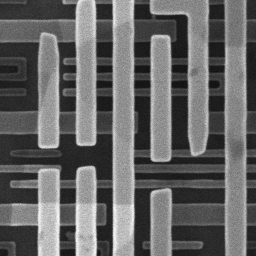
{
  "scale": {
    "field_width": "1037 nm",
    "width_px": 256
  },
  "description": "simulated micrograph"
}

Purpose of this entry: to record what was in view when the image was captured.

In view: wiring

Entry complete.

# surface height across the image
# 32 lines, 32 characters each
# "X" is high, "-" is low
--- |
----------XX--XXX--XXXXXXX--XXX-
---------XXX--XXX--XXXXXXX--XXX-
---------XXX--XXX-------XX--XXX-
---------XXX--XXX-------XX--XXX-
-----XX--XXX--XXX--XX---XX--XXX-
-----XX--XXX--XXX--XX---XX--XXX-
-----XX---XX--XXX--XX---XX--XXX-
-----XX---XX--XXX--XX---XX--XXX-
-----XX---XX--XXX--XX---XX--XXX-
-----XX---XX--XXX--XX---XX--XXX-
-----XX---XX--XXX--XX---XX--XXX-
-----XX---XX--XXX--XX---XX--XXX-
-----XX---XX--XXX--XX---XX--XXX-
-----XX---XX--XXX--XX---XX--XXX-
-----XX---XX--XXX--XX---XX--XXX-
-----XX--XXX--XXX--XX---XX--XXX-
-----XX--XXX--XXX--XX---XX--XXX-
-----XX---XX--XXX--XX---XX--XXX-
--------------XXX--XX---XX--XXX-
--------------XXX--XX-------XXX-
--------------XXX-----------XXX-
-----XX---XX--XXX-----------XXX-
-----XX---XX--XXX-----------XXX-
-----XX---XX--XXX-----------XXX-
-----XX---XX--XXX--XX-------XXX-
-----XX---XX--XXX--XX-------XXX-
-----XX--XXX--XXX--XX-------XXX-
-----XX--XXX--XXX--XX-------XXX-
-----XX--XXX--XXX--XX-------XXX-
-----XX--XXX--XXX--XX-------XXX-
-----XX--XXX--XXX--XX-------XXX-
-----XX--XXX--XXX--XX-------XXX-